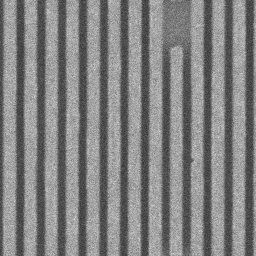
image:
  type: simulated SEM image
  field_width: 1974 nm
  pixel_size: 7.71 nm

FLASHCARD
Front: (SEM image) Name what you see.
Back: parallel lines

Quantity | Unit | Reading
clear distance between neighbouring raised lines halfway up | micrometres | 0.0617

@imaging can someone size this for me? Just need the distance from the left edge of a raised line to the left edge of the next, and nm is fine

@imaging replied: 161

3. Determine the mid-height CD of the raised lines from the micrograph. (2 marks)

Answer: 0.0964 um